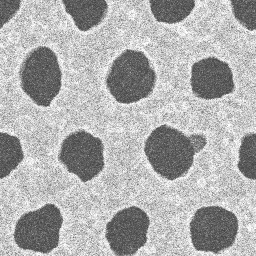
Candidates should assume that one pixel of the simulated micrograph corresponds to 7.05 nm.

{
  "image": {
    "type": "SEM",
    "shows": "holes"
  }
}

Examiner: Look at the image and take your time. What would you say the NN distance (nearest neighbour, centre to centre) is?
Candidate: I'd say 0.607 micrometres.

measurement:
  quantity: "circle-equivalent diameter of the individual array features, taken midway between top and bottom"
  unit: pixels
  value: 48.6